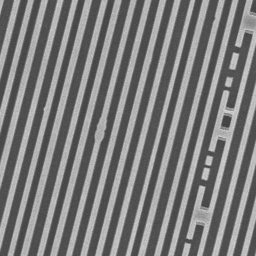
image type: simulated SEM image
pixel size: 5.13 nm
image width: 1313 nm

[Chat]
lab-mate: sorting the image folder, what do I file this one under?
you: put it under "parallel lines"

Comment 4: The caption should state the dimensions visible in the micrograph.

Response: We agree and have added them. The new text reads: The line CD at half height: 30.5 nanometres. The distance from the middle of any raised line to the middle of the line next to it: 72.6 nm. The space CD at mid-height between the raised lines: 42.8 nm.